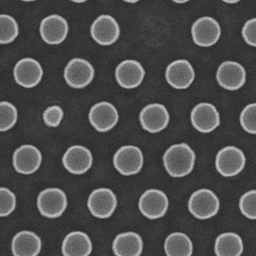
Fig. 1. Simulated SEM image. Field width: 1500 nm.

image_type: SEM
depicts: a regular array of raised bodies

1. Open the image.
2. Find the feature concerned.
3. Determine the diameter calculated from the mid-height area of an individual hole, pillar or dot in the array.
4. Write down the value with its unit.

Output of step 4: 161 nm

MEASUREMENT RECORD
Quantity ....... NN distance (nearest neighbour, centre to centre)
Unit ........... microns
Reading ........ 0.292